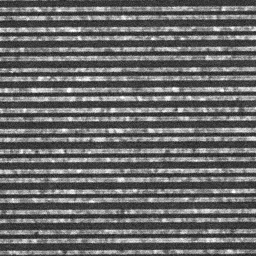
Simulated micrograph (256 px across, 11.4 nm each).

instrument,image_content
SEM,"parallel lines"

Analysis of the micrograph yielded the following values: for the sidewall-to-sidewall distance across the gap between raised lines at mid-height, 7.25 px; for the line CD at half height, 0.0412 um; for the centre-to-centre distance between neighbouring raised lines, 115 nanometers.